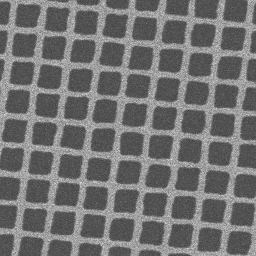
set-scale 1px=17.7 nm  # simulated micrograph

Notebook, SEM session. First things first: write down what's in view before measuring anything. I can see a regular array of holes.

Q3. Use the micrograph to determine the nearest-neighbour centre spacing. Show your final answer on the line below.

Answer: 0.506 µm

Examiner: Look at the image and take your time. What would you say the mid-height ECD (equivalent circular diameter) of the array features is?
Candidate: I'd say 460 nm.